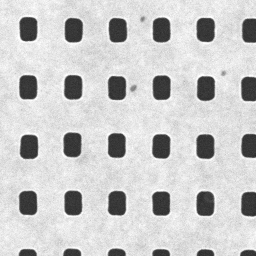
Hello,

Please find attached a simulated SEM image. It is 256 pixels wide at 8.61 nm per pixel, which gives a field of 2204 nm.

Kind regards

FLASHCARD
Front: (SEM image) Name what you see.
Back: a regular array of holes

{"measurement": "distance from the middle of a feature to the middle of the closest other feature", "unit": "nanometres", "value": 379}